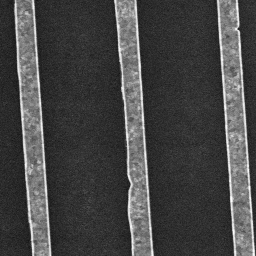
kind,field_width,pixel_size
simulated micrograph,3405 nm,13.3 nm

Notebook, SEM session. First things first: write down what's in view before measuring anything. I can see one or a few lines or trenches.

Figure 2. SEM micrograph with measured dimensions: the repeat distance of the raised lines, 1350 nanometres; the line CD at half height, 254 nm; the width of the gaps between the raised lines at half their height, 1100 nm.